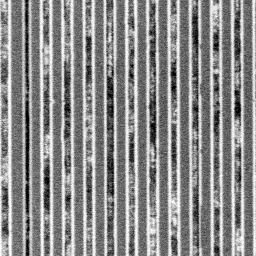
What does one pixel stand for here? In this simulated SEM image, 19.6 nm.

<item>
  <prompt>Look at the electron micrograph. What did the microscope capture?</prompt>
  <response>parallel lines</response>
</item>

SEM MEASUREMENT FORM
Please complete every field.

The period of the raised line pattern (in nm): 411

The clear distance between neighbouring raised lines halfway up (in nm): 186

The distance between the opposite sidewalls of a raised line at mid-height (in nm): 237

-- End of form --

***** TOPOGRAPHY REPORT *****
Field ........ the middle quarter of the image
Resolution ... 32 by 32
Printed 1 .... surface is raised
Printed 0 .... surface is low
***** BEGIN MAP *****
00111001110001100011100111000110
00111000110001100011100111000110
00111000110001100011100111000110
00111000110001100011100111000110
00111000110001100011100111000110
00111000110001100011100111000110
00111000110001100011100111000110
00111000110001100011100111000110
00111000110001100011100111000110
00111000110001100011100111000110
00111000110001110011100111000111
00111000110001110011100111000111
00111000110001110011100111000111
00111000110001110011100111000111
00111000110001110011100111000111
00111000110001110011100111000111
00111000110001110011100111000111
00111000110001110011100111000111
00111000110001110011100111000111
00111000110001110011100111000111
00111000110001110011100111000111
00111000110001110011100111000111
00111000110001110011100111000111
00111000110001110011100111000111
00111000110001110011100111000111
00111000110001110011100111000111
00111000110001110011100111000111
00111000110001110011100111000111
00111000110001110011100111000111
00111000110001110011100111000111
00111000110001110011100111000111
00111000110001110011100111000111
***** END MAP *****